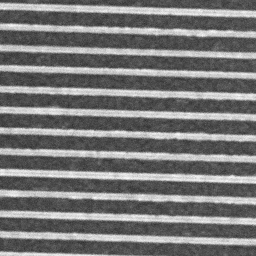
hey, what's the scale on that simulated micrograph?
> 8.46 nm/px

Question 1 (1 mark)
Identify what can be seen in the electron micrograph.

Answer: parallel lines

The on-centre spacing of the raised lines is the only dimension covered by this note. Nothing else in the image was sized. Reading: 175 nanometres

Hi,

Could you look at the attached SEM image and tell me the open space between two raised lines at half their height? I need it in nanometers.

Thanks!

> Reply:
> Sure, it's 135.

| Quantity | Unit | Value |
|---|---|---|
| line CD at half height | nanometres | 42.3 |